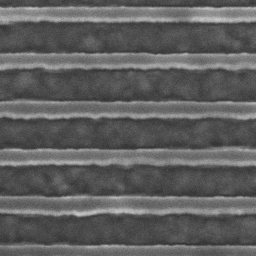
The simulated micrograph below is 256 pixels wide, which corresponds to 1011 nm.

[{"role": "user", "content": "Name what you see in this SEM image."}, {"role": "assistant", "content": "lines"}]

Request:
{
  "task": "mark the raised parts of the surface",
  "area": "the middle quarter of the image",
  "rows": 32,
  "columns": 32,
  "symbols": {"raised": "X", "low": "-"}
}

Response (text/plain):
XXXXXXXXXXXXXXXXXXXXXXXXXXXXXXXX
--------------------------------
--------------------------------
--------------------------------
--------------------------------
--------------------------------
--------------------------------
--------------------------------
--------------------------------
XXXXXXXXX----XX--XXXXX--X-XXXXXX
XXXXXXXXXXXXXXXXXXXXXXXXXXXXXXXX
XXXXXXXXXXXXXXXXXXXXXXXXXXXXXXXX
XXXXXXXXXXXXXXXXXXXXXXXXXXXXXXXX
--------------------------------
--------------------------------
--------------------------------
--------------------------------
--------------------------------
--------------------------------
--------------------------------
--------------------------------
XXX-XXXXX---------XXXXXXXX-----X
XXXXXXXXXXXXXXXXXXXXXXXXXXXXXXXX
XXXXXXXXXXXXXXXXXXXXXXXXXXXXXXXX
XXXXXXXXXXXXXXXXXXX-XXXXXXXXXXXX
--------------------------------
--------------------------------
--------------------------------
--------------------------------
--------------------------------
--------------------------------
--------------------------------